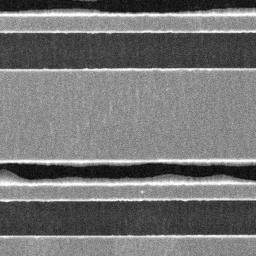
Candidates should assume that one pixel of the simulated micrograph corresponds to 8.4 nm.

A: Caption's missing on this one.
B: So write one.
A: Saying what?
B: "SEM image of lines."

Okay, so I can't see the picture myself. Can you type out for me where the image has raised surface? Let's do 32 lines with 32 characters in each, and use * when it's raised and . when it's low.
................................
................................
********************************
********************************
................................
................................
................................
................................
................................
********************************
********************************
********************************
********************************
********************************
********************************
********************************
********************************
********************************
********************************
********************************
................................
................................
**..............................
********************************
********************************
................................
................................
................................
................................
....................*..**.***.*.
********************************
********************************